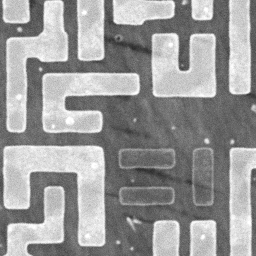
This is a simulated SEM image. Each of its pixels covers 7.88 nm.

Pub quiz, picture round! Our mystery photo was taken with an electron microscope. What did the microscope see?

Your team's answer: wiring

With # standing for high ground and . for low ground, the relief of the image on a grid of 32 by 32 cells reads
####..##..###.########..##...##.
####..##..###.########..##...##.
.##...##..###.####...........##.
......##..###................##.
.....###..###......###..###..##.
.#######..###......###..###..##.
.#######..###......###..###..##.
.##..##............###..###..##.
.##................###..###..##.
.##...###########..########..##.
.##..############..########..##.
.##..############..########..##.
.##...##........................
.##..###........................
.##..########...................
.##..########...................
................................
................................
.###########....................
.############..#######..###..###
#############..#######..###..###
####.....####...........###..##.
.###......###...........###..##.
.###..##..###...........###..##.
.###..##..###..#######..###..##.
.###..##..###....##......#...##.
......##..###................##.
......##..###................##.
.#######..###......###..###..##.
.#######..###......###..###..##.
.###......###......###..###..##.
.##................###..###..##.